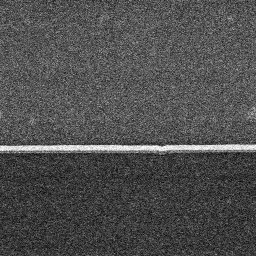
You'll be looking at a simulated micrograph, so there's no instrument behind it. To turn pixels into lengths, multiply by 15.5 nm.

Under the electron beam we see one or a few lines or trenches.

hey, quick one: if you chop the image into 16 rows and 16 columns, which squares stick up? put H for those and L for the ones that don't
LLLLLLLLLLLLLLLL
LLLLLLLLLLLLLLLL
LLLLLLLLLLLLLLLL
LLLLLLLLLLLLLLLL
LLLLLLLLLLLLLLLL
LLLLLLLLLLLLLLLL
LLLLLLLLLLLLLLLL
LLLLLLLLLLLLLLLL
LLLLLLLLLLLLLLLL
HHHHHHHHHHHHHHHH
HHHHHHHHHHHHHHHH
HHHHHHHHHHHHHHHH
HHHHHHHHHHHHHHHH
HHHHHHHHHHHHHHHH
HHHHHHHHHHHHHHHH
HHHHHHHHHHHHHHHH